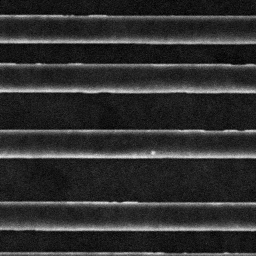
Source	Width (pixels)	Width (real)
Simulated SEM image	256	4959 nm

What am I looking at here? lines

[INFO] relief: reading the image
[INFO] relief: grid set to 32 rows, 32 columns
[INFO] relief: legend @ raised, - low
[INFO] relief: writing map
--------------------------------
--------------------------------
@@@@@@@@@@@@@@@@@@@@@@@@@@@@@@@@
@@@@@@@@@@@@@@@@@@@@@@@@@@@@@@@@
@@@@@@@@@@@@@@@@@@@@@@@@@@@@@@@@
--------------------------------
--------------------------------
--------------------------------
@@@@@@@@@@@@@@@@@@@@@@@@@@@@@@@@
@@@@@@@@@@@@@@@@@@@@@@@@@@@@@@@@
@@@@@@@@@@@@@@@@@@@@@@@@@@@@@@@@
--------------------------------
--------------------------------
--------------------------------
--------------------------------
--------------------------------
@@@@@@@@@@@@@@@@@@@@@@@@@@@@@@@@
@@@@@@@@@@@@@@@@@@@@@@@@@@@@@@@@
@@@@@@@@@@@@@@@@@@@@@@@@@@@@@@@@
----------@@@@@@@@@-----@@-@@---
--------------------------------
--------------------------------
--------------------------------
--------------------------------
--------------------------------
@@@@@@@@@@@@@@@@@@@@@@@@@@@@@@@@
@@@@@@@@@@@@@@@@@@@@@@@@@@@@@@@@
@@@@@@@@@@@@@@@@@@@@@@@@@@@@@@@@
@---@@@@@@@@@@@@@@@@@@@@@@@@@@@@
--------------------------------
--------------------------------
--------------------------------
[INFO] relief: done